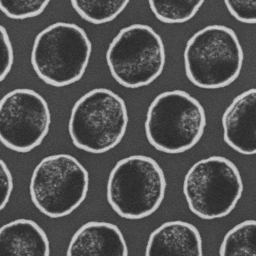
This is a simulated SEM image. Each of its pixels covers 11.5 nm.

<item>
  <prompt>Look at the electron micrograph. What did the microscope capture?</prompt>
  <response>a regular array of raised bodies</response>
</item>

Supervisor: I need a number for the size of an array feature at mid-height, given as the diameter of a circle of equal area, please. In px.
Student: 57.6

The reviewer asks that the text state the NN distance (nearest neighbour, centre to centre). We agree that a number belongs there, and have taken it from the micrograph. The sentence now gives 865 nm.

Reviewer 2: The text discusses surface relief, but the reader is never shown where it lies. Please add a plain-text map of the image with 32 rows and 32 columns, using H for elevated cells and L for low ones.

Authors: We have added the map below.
HHHHHHLLLHHHHHHHLLLHHHHHHLLLHHHH
LHHHHLLLLLHHHHHLLLLHHHHHLLLLLHHH
LLLLLLLLLLLHHLLLLLLLLHHLLLLLLLHH
LLLLLLHHHHLLLLLLHHLLLLLLLLHLLLLL
HLLLLHHHHHHLLLLHHHHHLLLLHHHHHLLL
HLLLHHHHHHHLLLHHHHHHLLLLHHHHHHLL
HLLLHHHHHHHLLLHHHHHHLLLHHHHHHHLL
HLLLHHHHHHHLLLHHHHHHLLLHHHHHHHLL
HLLLLHHHHHLLLLHHHHHHLLLHHHHHHHLL
LLLLLHHHHHLLLLHHHHHLLLLLHHHHHLLL
LLLLLLLHLLLLLLLHHHLLLLLLLHHHLLLL
LLHHLLLLLLLLHHLLLLLLLLLLLLLLLLLH
HHHHHLLLLLHHHHHLLLLLHHHHLLLLLLHH
HHHHHHLLLHHHHHHLLLLHHHHHHLLLLHHH
HHHHHHLLLHHHHHHHLLLHHHHHHLLLHHHH
HHHHHHLLLHHHHHHHLLHHHHHHHLLLHHHH
HHHHHHLLLHHHHHHLLLHHHHHHHLLLHHHH
HHHHHLLLLHHHHHHLLLLHHHHHLLLLHHHH
LLHHLLLLLLHHHHLLLLLLHHHLLLLLLLHH
LLLLLLLHLLLLLLLLLLLLLLLLLLLLLLLL
LLLLLHHHHHLLLLLHHHHLLLLLLHHHHLLL
HLLLHHHHHHHLLLHHHHHHLLLLHHHHHHLL
HLLLHHHHHHHLLLHHHHHHLLLHHHHHHHLL
HLLLHHHHHHHLLLHHHHHHLLLHHHHHHHLL
HLLLHHHHHHLLLLHHHHHHLLLHHHHHHHLL
HLLLLHHHHHLLLLHHHHHHLLLLHHHHHLLL
LLLLLLHHHLLLLLLHHHHLLLLLHHHHLLLL
LLLLLLLLLLLLLLLLLLLLLLLLLLLLLLLL
HHHHHLLLLLHHHHLLLLLLHHHHLLLLLLHH
HHHHHLLLLLHHHHHLLLLHHHHHHLLLHHHH
HHHHHHLLLHHHHHHHLLLHHHHHHLLLHHHH
HHHHHHLLLHHHHHHHLLHHHHHHHLLLHHHH